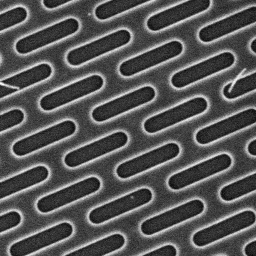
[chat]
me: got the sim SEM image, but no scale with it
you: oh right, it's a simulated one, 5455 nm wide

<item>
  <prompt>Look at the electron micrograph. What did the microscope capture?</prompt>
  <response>groups of lines, slits or small figures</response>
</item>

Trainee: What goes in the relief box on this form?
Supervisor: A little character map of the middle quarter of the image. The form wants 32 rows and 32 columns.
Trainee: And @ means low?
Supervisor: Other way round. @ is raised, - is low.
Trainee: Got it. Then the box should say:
@@-@@@@@@@@@@@--------@@@@@@@@@-
@@@@@@@@@@@@@@------@@@@@@@@@---
@@@@@@@@@@@@@@----@@@@@@@@@-----
@@@@@-----@@@@@@@@@@@@@@@@@-----
@@--------@@@@@@@@@@@@@@@@@-----
----------@@@@@@@@@@-@@@@@@---@@
--------@@@@@@@@@@-----@@@@@@@@@
------@@@@@@@@@--------@@@@@@@@@
----@@@@@@@@@---------@@@@@@@@@@
-@@@@@@@@@@----------@@@@@@@@@--
@@@@@@@@-----------@@@@@@@@@----
@@@@@@@---------@@@@@@@@@-------
@@@@@@@-------@@@@@@@@@---------
@@@@@@@-----@@@@@@@@@----------@
--@@@@@@@@@@@@@@@@@@---------@@@
---@@@@@@@@@@@@@@@@@------@@@@@@
---@@@@@@@@@@@@@@@@@----@@@@@@@@
--@@@@@@@@@@----@@@@@@@@@@@@@@@@
@@@@@@@@@-------@@@@@@@@@@@@@@@@
@@@@@@@---------@@@@@@@@@@@@@@@@
@@@@@----------@@@@@@@@@-----@@@
@@-----------@@@@@@@@@-------@@@
@---------@@@@@@@@@----------@@@
--------@@@@@@@@@----------@@@@@
------@@@@@@@@@----------@@@@@@@
@--@@@@@@@@@@----------@@@@@@@@@
@@@@@@@@@@@@@--------@@@@@@@@@--
@@@@@@@@@@@@@-----@@@@@@@@@-----
@@@@@---@@@@@@--@@@@@@@@@@------
@@@------@@@@@@@@@@@@@@@@@------
@--------@@@@@@@@@@@@@@@@@-----@
--------@@@@@@@@@@---@@@@@@@@@@@